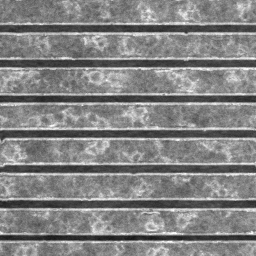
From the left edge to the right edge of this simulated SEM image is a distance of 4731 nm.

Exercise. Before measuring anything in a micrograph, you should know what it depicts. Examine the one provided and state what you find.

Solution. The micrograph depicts parallel lines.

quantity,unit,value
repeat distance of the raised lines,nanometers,650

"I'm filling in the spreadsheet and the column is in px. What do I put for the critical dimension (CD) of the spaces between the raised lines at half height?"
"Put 9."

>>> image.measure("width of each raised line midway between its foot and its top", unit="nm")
483